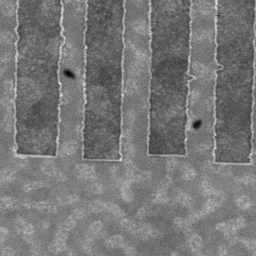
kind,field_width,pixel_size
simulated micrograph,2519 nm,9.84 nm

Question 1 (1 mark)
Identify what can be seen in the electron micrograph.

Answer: one or a few lines or trenches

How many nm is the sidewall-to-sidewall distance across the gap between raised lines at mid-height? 252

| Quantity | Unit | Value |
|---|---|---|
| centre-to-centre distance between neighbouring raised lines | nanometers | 645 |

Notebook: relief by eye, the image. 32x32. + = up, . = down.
..++++++...+++++...+++++...+++++
..++++++...+++++...+++++...+++++
..++++++...++++....+++++...+++++
..++++++...+++++...+++++...+++++
..++++++...++++....+++++...+++++
..++++++...++++....+++++...+++++
..++++++...++++....+++++...+++++
..+++++....++++....+++++...+++++
..+++++....++++....+++++...+++++
..+++++....++++....+++++...+++++
..++++++...++++....+++++...+++++
..++++++...++++....+++++...+++++
..++++++...++++....++++....+++++
..+++++...+++++....++++....+++++
..+++++...+++++....++++....+++++
..+++++...+++++....++++....+++++
..+++++...+++++....++++....+++++
..+++++...+++++....++++....++++.
..+++++...+++++....++++....+++++
......+...+++++............++++.
................................
................................
................................
................................
................................
................................
................................
................................
................................
................................
................................
................................